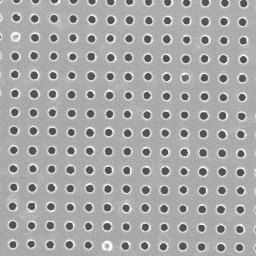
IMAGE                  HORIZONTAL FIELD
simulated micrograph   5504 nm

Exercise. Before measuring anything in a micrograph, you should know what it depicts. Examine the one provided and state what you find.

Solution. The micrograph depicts a regular array of holes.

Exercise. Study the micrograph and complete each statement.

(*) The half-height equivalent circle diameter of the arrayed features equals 166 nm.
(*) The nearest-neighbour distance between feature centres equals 397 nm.